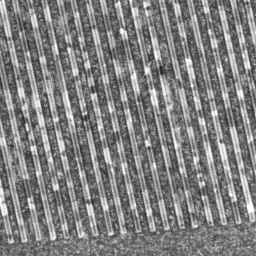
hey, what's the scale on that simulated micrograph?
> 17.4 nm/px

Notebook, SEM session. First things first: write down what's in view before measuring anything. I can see parallel lines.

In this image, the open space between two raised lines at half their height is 178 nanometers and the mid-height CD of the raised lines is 0.0637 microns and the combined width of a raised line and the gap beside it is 0.246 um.